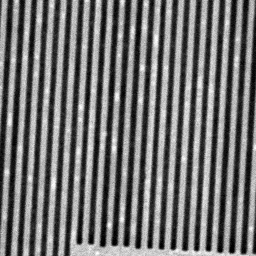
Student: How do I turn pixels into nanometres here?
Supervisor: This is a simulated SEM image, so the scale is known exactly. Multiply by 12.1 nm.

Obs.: parallel lines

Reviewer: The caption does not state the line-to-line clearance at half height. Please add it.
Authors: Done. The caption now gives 77 nm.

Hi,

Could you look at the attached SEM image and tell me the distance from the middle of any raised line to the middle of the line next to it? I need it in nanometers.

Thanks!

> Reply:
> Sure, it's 142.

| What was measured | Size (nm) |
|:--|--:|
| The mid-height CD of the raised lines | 64.9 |